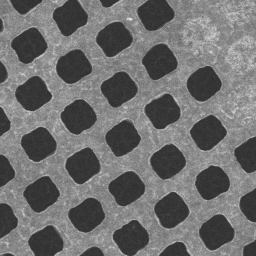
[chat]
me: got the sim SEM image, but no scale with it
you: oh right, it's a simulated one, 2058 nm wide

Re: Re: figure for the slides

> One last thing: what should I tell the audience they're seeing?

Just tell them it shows a regular array of holes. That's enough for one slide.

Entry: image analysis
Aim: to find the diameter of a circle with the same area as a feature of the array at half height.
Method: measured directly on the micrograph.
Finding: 0.271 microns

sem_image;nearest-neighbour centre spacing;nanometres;392